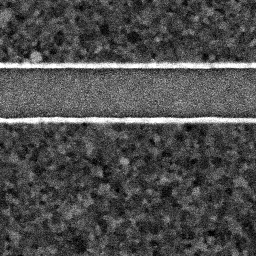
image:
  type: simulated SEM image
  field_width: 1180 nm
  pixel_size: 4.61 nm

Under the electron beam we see one or a few lines or trenches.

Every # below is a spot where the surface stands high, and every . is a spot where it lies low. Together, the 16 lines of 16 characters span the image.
################
################
################
################
................
................
................
..#######.######
################
################
################
################
################
################
################
################